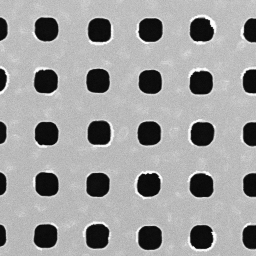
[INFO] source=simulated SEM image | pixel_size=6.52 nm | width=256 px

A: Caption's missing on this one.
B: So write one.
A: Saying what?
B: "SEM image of a regular array of holes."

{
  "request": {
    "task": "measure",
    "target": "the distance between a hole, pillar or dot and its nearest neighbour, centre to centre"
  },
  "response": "332 nanometers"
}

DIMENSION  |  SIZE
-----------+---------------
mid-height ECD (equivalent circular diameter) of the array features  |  162 nanometres